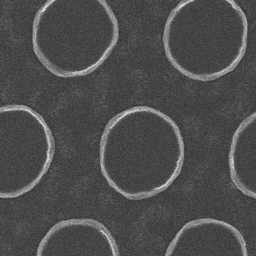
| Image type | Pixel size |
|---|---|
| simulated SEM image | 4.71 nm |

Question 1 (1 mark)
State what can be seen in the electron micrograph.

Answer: raised bodies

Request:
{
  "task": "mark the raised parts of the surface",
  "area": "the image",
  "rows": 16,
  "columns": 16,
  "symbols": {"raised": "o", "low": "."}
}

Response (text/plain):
...oooo....oooo.
..ooooo...ooooo.
..ooooo...ooooo.
...oooo....oooo.
...oo......ooo..
................
................
ooo....oooo.....
ooo....oooo....o
ooo...ooooo...oo
ooo...ooooo...oo
oo.....ooo.....o
................
................
...oooo....oooo.
...oooo....oooo.